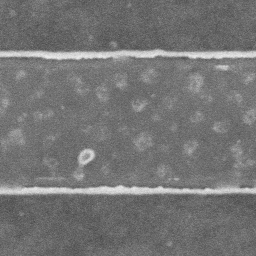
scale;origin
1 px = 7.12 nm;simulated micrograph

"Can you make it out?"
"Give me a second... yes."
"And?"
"one or a few lines or trenches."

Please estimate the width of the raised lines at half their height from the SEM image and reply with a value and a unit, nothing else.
980 nm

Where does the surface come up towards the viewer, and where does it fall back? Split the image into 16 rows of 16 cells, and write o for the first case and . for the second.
................
................
................
oooooooooooooooo
oooooooooooooooo
oooooooooooooooo
oooooooooooooooo
oooooooooooooooo
oooooooooooooooo
oooooooooooooooo
oooooooooooooooo
oooooooooooooooo
................
................
................
................